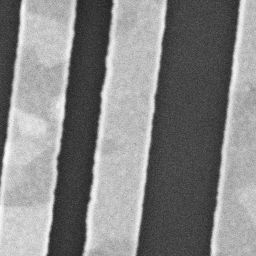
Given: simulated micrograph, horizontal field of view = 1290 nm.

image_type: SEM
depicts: lines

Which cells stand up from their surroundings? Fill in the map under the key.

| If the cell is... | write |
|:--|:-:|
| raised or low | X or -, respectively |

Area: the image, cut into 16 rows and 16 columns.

-XXXX--XXX-----X
-XXXX--XXX-----X
-XXXX--XXX-----X
-XXX---XXX-----X
-XXX---XXX-----X
-XXX--XXXX----XX
-XXX--XXXX----XX
-XXX--XXXX----XX
XXXX--XXX-----XX
XXXX--XXX-----XX
XXXX--XXX-----XX
XXX---XXX-----XX
XXX---XXX-----XX
XXX---XXX----XXX
XXX--XXXX----XXX
XXX--XXXX----XXX